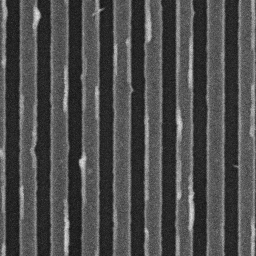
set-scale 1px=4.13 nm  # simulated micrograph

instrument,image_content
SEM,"parallel lines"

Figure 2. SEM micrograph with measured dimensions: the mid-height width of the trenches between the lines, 60.4 nanometers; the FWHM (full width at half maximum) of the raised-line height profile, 67.7 nm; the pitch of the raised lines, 31.2 px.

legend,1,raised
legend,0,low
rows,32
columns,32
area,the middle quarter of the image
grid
10000111100001111000111100001111
10000111100011111000111100001111
10000111100011111000111100001111
10001111100011111000111100001111
10000111100001111000111100001111
10000111100011111000111100001111
10000111100011111000111100001111
10000111100011111000111100001111
10000111100011111000111100001111
10000111100001111000111100001111
10000111100011111000111100001111
10000111100001111000111100001111
10000111100001111000111100001111
10000111100001111000111100001111
10000111100001111000111100001111
10000111100011111000111100001111
10000111100001111000111100001111
10000111100011111000111100001111
10000111100011111000111100001111
10000111100001111000111100001111
10000111100011110000111100001111
10000111100011111000111100001111
10000111100011110000111100001111
10001111100011111000111100001111
10001111100001111000111100001111
10001111100011111000111100001111
10001111100011111000111100001111
10001111100011110000111100001111
10001111100001111000111100001111
10001111100011111000111100001111
10001111100011111000111100001111
10001111100011110000111100001111